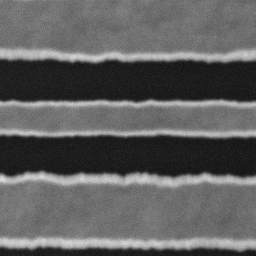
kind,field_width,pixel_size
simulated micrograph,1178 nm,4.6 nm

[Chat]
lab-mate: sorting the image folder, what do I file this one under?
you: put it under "lines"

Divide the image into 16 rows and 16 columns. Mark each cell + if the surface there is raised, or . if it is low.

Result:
++++++++++++++++
++++++++++++++++
++++++++++++++++
++++++++++++++++
................
................
++++++++++++++++
++++++++++++++++
..++...+...+++++
................
................
++++++++++++++++
++++++++++++++++
++++++++++++++++
++++++++++++++++
.........+.+..++